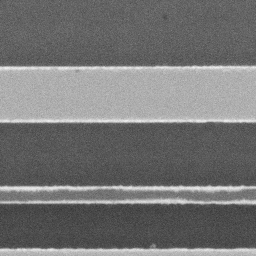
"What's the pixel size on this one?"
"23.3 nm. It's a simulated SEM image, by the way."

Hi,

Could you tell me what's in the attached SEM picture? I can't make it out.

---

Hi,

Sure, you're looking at lines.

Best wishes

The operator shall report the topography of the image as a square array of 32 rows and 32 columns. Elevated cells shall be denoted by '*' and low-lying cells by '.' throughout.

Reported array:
................................
................................
................................
................................
................................
................................
................................
................................
********************************
********************************
********************************
********************************
********************************
********************************
********************************
................................
................................
................................
................................
................................
................................
................................
................................
********************************
********************************
................................
................................
................................
................................
................................
................................
********************************